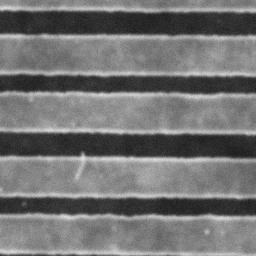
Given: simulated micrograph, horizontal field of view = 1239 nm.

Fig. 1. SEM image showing lines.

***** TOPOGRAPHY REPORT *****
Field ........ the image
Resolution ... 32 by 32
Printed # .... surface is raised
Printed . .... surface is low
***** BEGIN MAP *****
################################
................................
................................
................................
#####################.####......
################################
################################
################################
################################
................................
................................
................................
################################
################################
################################
################################
............####################
................................
................................
..........#.....................
################################
################################
################################
################################
################################
................................
................................
################################
################################
################################
################################
################################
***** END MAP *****